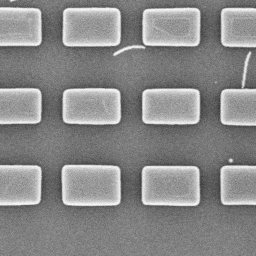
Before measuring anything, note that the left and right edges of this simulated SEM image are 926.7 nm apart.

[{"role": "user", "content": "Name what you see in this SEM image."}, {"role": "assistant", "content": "wiring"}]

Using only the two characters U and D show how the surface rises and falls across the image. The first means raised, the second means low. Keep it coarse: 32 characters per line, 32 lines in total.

DDDDDDDDDDDDDDDDDDDDDDDDDDDDDDDD
UUUUUDDDUUUUUUUDDDUUUUUUUDDDUUUU
UUUUUDDDUUUUUUUDDDUUUUUUUDDDUUUU
UUUUUDDDUUUUUUUDDDUUUUUUUDDDUUUU
UUUUUDDDUUUUUUUDDDUUUUUUUDDDUUUU
UUUUUDDDUUUUUUUDDDUUUUUUUDDDUUUU
DDDDDDDDDDDDDDDDDDDDDDDDDDDDDDDD
DDDDDDDDDDDDDDDDDDDDDDDDDDDDDDDD
DDDDDDDDDDDDDDDDDDDDDDDDDDDDDDDD
DDDDDDDDDDDDDDDDDDDDDDDDDDDDDDDD
DDDDDDDDDDDDDDDDDDDDDDDDDDDDDDDD
UUUUUDDDUUUUUUUDDDUUUUUUUDDDUUUU
UUUUUDDDUUUUUUUDDDUUUUUUUDDDUUUU
UUUUUDDDUUUUUUUDDDUUUUUUUDDDUUUU
UUUUUDDDUUUUUUUDDDUUUUUUUDDDUUUU
DDDDDDDDDDDDDDDDDDDDDDDDDDDDUUUU
DDDDDDDDDDDDDDDDDDDDDDDDDDDDDDDD
DDDDDDDDDDDDDDDDDDDDDDDDDDDDDDDD
DDDDDDDDDDDDDDDDDDDDDDDDDDDDDDDD
DDDDDDDDDDDDDDDDDDDDDDDDDDDDDDDD
DDDDDDDDDDDDDDDDDDDDDDDDDDDDDDDD
UUUUUDDDUUUUUUUDDDUUUUUUUDDDUUUU
UUUUUDDDUUUUUUUDDDUUUUUUUDDDUUUU
UUUUUDDDUUUUUUUDDDUUUUUUUDDDUUUU
UUUUUDDDUUUUUUUDDDUUUUUUUDDDUUUU
UUUDDDDDUUUUUUUDDDDUUUUUDDDDDDDD
DDDDDDDDDDDDDDDDDDDDDDDDDDDDDDDD
DDDDDDDDDDDDDDDDDDDDDDDDDDDDDDDD
DDDDDDDDDDDDDDDDDDDDDDDDDDDDDDDD
DDDDDDDDDDDDDDDDDDDDDDDDDDDDDDDD
DDDDDDDDDDDDDDDDDDDDDDDDDDDDDDDD
DDDDDDDDDDDDDDDDDDDDDDDDDDDDDDDD